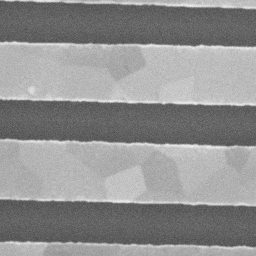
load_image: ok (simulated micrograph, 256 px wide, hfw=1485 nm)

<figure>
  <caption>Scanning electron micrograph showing lines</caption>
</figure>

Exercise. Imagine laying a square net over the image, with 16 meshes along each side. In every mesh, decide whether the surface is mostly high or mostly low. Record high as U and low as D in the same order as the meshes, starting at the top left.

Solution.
DDDDDDDDDDDDDDDU
DDDDDDDDDDDDDDDD
DDDDDDDDDDDDDDDD
UUUUUUUUUUUUUUUU
UUUUUUUUUUUUUUUU
UUUUUUUUUUUUUUUU
DDDDDDDDDDDDUUUU
DDDDDDDDDDDDDDDD
DDDDDDDDDDDDDDDD
UUUUUUUUUUUUUUUU
UUUUUUUUUUUUUUUU
UUUUUUUUUUUUUUUU
DDUUUUUUUUUUUUUU
DDDDDDDDDDDDDDDD
DDDDDDDDDDDDDDDD
UUUUUUUUUUUUUUUU